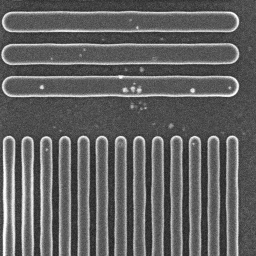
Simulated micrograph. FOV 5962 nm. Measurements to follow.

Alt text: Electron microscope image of groups of lines, slits or small figures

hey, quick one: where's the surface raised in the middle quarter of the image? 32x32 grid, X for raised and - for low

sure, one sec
--------------------------------
--------------------------------
--------------------------------
XXXXXXXXXXXXXXXXXXXXXXXXXXXXXXXX
XXXXXXXXXXXXXXXXXXXXXXXXXXXXXXXX
XXXXXXXXXXXXXXXXXXXXXXXXXXXXXXXX
XXXXXXXXXXXXXXXXXXXXXXXXXXXXXXXX
XXXXXXXXXXXXXXXXXXXXXXXXXXXXXXXX
--------------------------------
--------------------------------
--------------------------------
--------------------------------
--------------------------------
--------------------------------
--------------------------------
--------------------------------
--------------------------------
--------------------------------
X---XX---X---XX---XX---X---XX---
XX--XX--XXX--XX--XXX--XXX--XX---
XX--XX--XXX--XX--XXX--XXX--XX--X
XX--XX--XXX--XX--XXX--XXX--XX--X
XX--XX--XXX--XX--XXX--XXX--XX---
XX--XX--XXX--XX--XXX--XXX--XX---
XX--XX--XXX--XX--XXX--XXX--XX---
XX--XX--XXX--XX--XXX--XXX--XX---
XX--XX--XXX--XX--XXX--XXX--XX---
XX--XX--XXX--XX--XXX--XXX--XX---
XX--XX--XXX--XX--XXX--XXX--XX---
XX--XX--XXX--XX--XXX--XXX--XX---
XX--XX--XXX--XX--XXX--XXX--XX---
XX--XX--XXX--XX--XXX--XXX--XX---